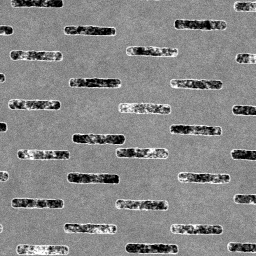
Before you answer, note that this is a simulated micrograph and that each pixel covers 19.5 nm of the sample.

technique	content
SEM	a regular array of holes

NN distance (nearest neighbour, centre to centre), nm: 930